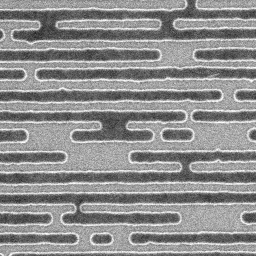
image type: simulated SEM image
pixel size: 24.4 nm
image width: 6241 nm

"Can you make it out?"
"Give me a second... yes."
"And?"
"parallel lines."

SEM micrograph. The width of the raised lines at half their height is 305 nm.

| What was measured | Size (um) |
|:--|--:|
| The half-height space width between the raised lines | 0.192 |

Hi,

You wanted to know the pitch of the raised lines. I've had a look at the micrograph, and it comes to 496 nanometers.